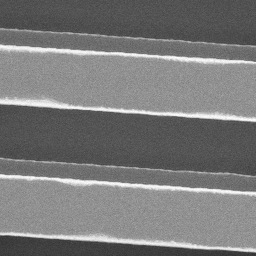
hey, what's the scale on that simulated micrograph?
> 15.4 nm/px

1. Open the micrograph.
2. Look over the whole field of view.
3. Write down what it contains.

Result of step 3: lines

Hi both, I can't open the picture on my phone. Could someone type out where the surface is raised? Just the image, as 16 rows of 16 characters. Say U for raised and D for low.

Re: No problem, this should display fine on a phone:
DDDDDDDDDDDDDDDD
DDDDDDDDDDDDDDDD
DDDDDDDDDDDDDDDD
UUUUUUUUUUDDDDDD
UUUUUUUUUUUUUUUU
UUUUUUUUUUUUUUUU
UUUUUUUUUUUUUUUU
DDDDDDDDDDDDDDDU
DDDDDDDDDDDDDDDD
DDDDDDDDDDDDDDDD
DDDDDDDDDDDDDDDD
UUUUUUUUDDDDDDDD
UUUUUUUUUUUUUUUU
UUUUUUUUUUUUUUUU
UUUUUUUUUUUUUUUU
DDDDDDDDDDDDUUUU